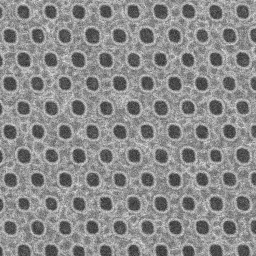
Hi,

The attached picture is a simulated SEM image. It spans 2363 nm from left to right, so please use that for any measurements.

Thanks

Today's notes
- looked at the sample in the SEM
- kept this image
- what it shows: a regular array of holes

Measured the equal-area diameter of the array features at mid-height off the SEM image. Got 139 nm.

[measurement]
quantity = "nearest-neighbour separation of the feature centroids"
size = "250 nanometres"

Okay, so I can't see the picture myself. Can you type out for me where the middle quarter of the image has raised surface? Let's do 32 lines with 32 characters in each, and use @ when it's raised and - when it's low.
@@@--@@@@---@@@@---@@@@--@@@@@--
@@@@@@@@@@@@@@@@@@@@@@@@@@@@@@@@
@@@@@@@@@@@@@@@@@@@@@@@@@@@@@@@@
-@@@@@--@@@@---@@@@---@@@@---@@@
--@@@----@@@----@@@---@@@@---@@@
--@@@----@@@----@@@----@@@----@@
--@@@@---@@@@---@@@@--@@@@@--@@@
@@@@@@@@@@@@@@@@@@@@@@@@@@@@@@@@
@@@@@@@@@@@@@@@@@@@@@@@@@@@@@@@@
@@---@@@@---@@@@---@@@@---@@@---
@@----@@@---@@@----@@@----@@@---
@@----@@@---@@@@---@@@----@@@---
@@@--@@@@---@@@@---@@@@---@@@@--
@@@@@@@@@@@@@@@@@@@@@@@@@@@@@@@@
@@@@@@@@@@@@@@@@@@@@@@@@@@@@@@@@
-@@@@@--@@@@---@@@@---@@@@---@@@
--@@@----@@@----@@@----@@@---@@@
--@@@----@@@----@@@----@@@---@@@
--@@@@---@@@@--@@@@@--@@@@@--@@@
@@@@@@@@@@@@@@@@@@@@@@@@@@@@@@@@
@@@@@@@@@@@@@@@@@@@@@@@@@@@@@@@@
@@---@@@@---@@@@---@@@@---@@@---
@@----@@@---@@@@---@@@----@@@---
@@----@@@---@@@@---@@@@---@@@---
@@@--@@@@@--@@@@---@@@@---@@@@--
@@@@@@@@@@@@@@@@@@@@@@@@@@@@@@@@
@@@@@@@@@@@@@@@@@@@@@@@@@@@@@@@@
-@@@@@--@@@@@--@@@@---@@@@---@@@
--@@@----@@@----@@@----@@@---@@@
--@@@@---@@@----@@@----@@@----@@
--@@@@---@@@@--@@@@@--@@@@@--@@@
@@@@@@@@@@@@@@@@@@@@@@@@@@@@@@@@